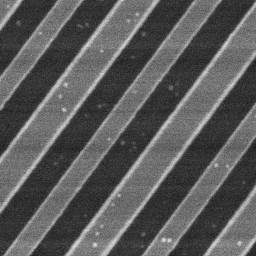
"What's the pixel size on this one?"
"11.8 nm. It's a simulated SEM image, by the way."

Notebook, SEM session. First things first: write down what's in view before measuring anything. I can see lines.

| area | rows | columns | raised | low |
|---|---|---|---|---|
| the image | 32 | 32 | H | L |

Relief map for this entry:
HHLLLLLHHHLLLLHHHHHHLLLLHHHLLLLL
HHLLLLHHHLLLLLHHHHHLLLLHHHHLLLLH
HLLLLHHHLLLLLHHHHHLLLLHHHHLLLLHH
LLLLLHHHLLLLHHHHHLLLLLHHHLLLLHHH
LLLLHHHLLLLHHHHHHLLLLHHHLLLLLHHH
LLLHHHLLLLLHHHHHLLLLHHHLLLLLHHHH
LLHHHHLLLLHHHHHLLLLHHHHLLLLHHHHH
LLHHHLLLLHHHHHLLLLLHHHLLLLHHHHHH
LHHHLLLLHHHHHHLLLLHHHLLLLLHHHHHL
HHHLLLLLHHHHHLLLLHHHLLLLLHHHHHLL
HHLLLLLHHHHHLLLLHHHHLLLLHHHHHLLL
HHLLLLHHHHHLLLLLHHHLLLLLHHHHHLLL
HLLLLHHHHHHLLLLHHHLLLLLHHHHHLLLL
LLLLLHHHHHLLLLHHHLLLLLHHHHHLLLLL
LLLLHHHHHLLLLLHHHLLLLHHHHHLLLLLH
LLLHHHHHLLLLLHHHLLLLHHHHHHLLLLHH
LLHHHHHHLLLLHHHLLLLLHHHHHLLLLHHH
LLHHHHHLLLLHHHHLLLLHHHHHLLLLLHHH
LHHHHHLLLLLHHHLLLLHHHHHLLLLLHHHL
HHHHHLLLLLHHHLLLLLHHHHHLLLLHHHLL
HHHHHLLLLHHHLLLLLHHHHHLLLLHHHLLL
HHHHLLLLHHHHLLLLHHHHHLLLLLHHHLLL
HHHLLLLLHHHLLLLHHHHHLLLLLHHHLLLL
HHLLLLLHHHLLLLHHHHHHLLLLHHHLLLLL
HHLLLLHHHLLLLLHHHHHLLLLHHHHLLLLH
HLLLLHHHLLLLLHHHHHLLLLLHHHLLLLHH
LLLLLHHHLLLLHHHHHLLLLLHHHLLLLLHH
LLLLHHHLLLLHHHHHHLLLLHHHLLLLLHHH
LLLHHHLLLLLHHHHHLLLLHHHHLLLLHHHH
LLHHHHLLLLHHHHHLLLLLHHHLLLLHHHHH
LLHHHLLLLHHHHHLLLLLHHHLLLLLHHHHH
LHHHLLLLLHHHHHLLLLHHHLLLLLHHHHHL